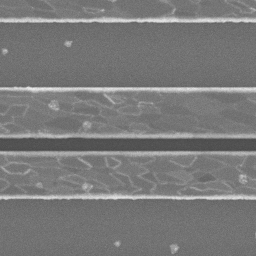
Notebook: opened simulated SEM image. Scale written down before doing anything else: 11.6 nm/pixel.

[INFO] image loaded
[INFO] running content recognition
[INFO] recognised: lines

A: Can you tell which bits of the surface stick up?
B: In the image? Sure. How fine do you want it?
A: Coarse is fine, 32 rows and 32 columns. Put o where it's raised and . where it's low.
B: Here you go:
oooooooooooooooooooooooooooooooo
oooooooooooooooooooooooooooooooo
oooooooooooooooooooooooooooooooo
................................
................................
................................
................................
................................
................................
................................
................................
oooooooooooooooooooooooooooooooo
oooooooooooooooooooooooooooooooo
oooooooooooooooooooooooooooooooo
oooooooooooooooooooooooooooooooo
oooooooooooooooooooooooooooooooo
oooooooooooooooooooooooooooooooo
................................
................................
oooooooooooooooooooooooooooooooo
oooooooooooooooooooooooooooooooo
oooooooooooooooooooooooooooooooo
oooooooooooooooooooooooooooooooo
oooooooooooooooooooooooooooooooo
oooooooooooooooooooooooooooooooo
................................
................................
................................
................................
................................
................................
................................